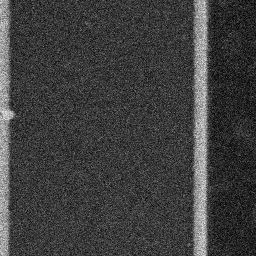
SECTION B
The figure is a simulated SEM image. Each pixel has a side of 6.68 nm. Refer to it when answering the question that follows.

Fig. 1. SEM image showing one or a few lines or trenches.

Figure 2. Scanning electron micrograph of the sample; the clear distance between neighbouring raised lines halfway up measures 198 pixels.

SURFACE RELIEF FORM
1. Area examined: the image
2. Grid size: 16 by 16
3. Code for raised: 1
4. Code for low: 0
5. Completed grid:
0000000000000111
0000000000000111
0000000000000111
0000000000000111
0000000000000111
0000000000000111
0000000000000111
0000000000000111
0000000000000111
0000000000000111
0000000000000111
0000000000000111
0000000000000111
0000000000000111
0000000000000111
0000000000000111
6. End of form